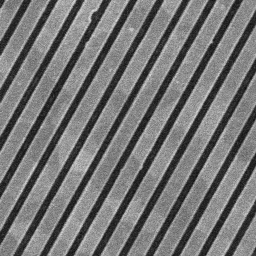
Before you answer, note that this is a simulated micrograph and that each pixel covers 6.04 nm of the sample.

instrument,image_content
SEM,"parallel lines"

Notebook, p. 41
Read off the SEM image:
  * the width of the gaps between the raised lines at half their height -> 49.4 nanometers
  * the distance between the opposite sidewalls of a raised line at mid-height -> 88.3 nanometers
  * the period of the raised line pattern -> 0.139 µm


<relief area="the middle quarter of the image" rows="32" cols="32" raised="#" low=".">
...####..#####..####..#####..###
..####...####...####..####...###
..####..#####..####..#####..####
.####...####..#####..####...####
.####..####...####..#####..####.
####...####..####...####..####..
###...####...####..####...####..
###..####...####...####..####...
##...####...####..####...####..#
##..#####..####..#####..####...#
#...####...####..####...####..##
#..#####..####...####..####...##
...####..####...####...####..###
..####...####..####...####..####
.#####..####...####..####...####
.####...####..####...####..####.
#####..####..#####..####...####.
####...####..####...####..####..
####..####..#####..####...####..
###..#####..####...####..####...
##...####..#####..####...####..#
##..####...####..#####..####...#
#...####..####...####..#####..##
#..####...####..####...####..###
...####..####...####..####...###
..####...####..####...####..####
..####..####...####..####...####
.####..#####..####...####..#####
#####..####...####..####...####.
####..#####..####...####..####..
###...####..#####..####...####..
###..####...####..#####..####...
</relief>